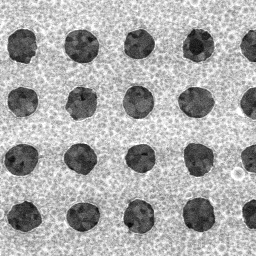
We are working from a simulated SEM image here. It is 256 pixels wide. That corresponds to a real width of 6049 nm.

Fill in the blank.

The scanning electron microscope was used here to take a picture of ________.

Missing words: a regular array of raised bodies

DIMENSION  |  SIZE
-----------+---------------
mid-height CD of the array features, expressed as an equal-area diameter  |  0.791 microns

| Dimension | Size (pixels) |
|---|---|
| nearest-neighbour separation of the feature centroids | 56.4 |